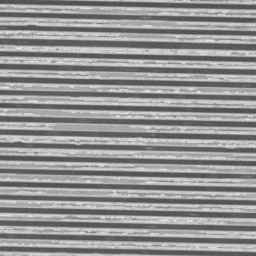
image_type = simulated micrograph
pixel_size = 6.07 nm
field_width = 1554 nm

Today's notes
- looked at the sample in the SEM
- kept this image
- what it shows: parallel lines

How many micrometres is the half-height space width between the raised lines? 0.0372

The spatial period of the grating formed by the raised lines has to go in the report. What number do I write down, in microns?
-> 0.0791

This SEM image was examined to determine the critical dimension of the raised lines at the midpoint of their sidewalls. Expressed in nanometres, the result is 41.8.